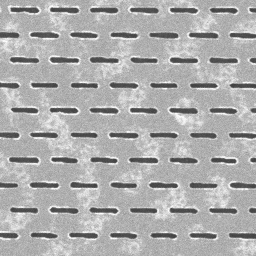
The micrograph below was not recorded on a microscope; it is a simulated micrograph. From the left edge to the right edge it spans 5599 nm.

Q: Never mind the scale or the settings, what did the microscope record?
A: a regular array of holes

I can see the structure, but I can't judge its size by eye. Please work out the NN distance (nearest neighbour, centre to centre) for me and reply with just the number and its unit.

693 nm